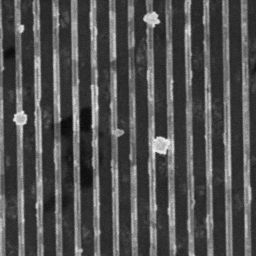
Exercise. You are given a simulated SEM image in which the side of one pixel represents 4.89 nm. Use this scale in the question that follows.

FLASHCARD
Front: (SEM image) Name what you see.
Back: parallel lines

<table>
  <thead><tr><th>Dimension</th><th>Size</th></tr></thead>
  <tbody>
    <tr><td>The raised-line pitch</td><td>92.4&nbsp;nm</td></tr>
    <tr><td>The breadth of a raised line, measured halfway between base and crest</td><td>25.1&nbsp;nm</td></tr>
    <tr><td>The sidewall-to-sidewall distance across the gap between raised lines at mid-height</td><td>66.6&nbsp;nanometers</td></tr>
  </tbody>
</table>